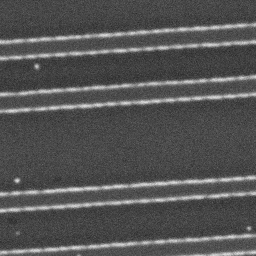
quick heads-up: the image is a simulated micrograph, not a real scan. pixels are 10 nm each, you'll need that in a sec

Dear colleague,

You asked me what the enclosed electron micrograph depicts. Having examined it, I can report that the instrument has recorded lines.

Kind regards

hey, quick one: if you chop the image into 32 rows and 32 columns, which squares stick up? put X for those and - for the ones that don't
--------------------------------
--------------------------------
--------------------------------
------------------------XXXXXXXX
----------XXXXXXXXXXXXXXXXXXXXXX
XXXXXXXXXXXXXXXXXXXXXXXXXXXXX---
XXXXXXXXXXXXXX------------------
--------------------------------
--------------------------------
--------------------------------
-------------------XXXXXXXXXXXXX
---XXXXXXXXXXXXXXXXXXXXXXXXXXXXX
XXXXXXXXXXXXXXXXXXXXXX----------
XXXXXXX-------------------------
--------------------------------
--------------------------------
--------------------------------
--------------------------------
--------------------------------
--------------------------------
--------------------------------
--------------------------------
----------------------------XXXX
-----------XXXXXXXXXXXXXXXXXXXXX
XXXXXXXXXXXXXXXXXXXXXXXXXXXX----
XXXXXXXXXXXXX-------------------
--------------------------------
--------------------------------
--------------------------------
------------------------------XX
----------------XXXXXXXXXXXXXXXX
XXXXXXXXXXXXXXXXXXXXXXXXXXXXXXXX